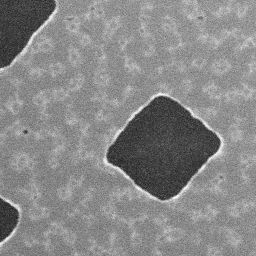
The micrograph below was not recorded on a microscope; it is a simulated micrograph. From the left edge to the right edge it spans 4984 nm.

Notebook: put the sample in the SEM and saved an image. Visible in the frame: holes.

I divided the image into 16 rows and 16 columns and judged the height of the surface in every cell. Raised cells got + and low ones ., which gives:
...+++++++++++++
...+++++++++++++
..++++++++++++++
.+++++++++++++++
++++++++++++++++
++++++++++++++++
+++++++++..+++++
++++++++....++++
+++++++.......++
+++++++.......++
+++++++......+++
++++++++....++++
++++++++++++++++
.+++++++++++++++
.+++++++++++++++
++++++++++++++++